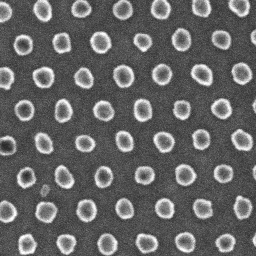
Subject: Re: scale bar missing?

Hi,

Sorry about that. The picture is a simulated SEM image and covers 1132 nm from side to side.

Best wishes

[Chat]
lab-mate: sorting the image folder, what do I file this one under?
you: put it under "a regular array of raised bodies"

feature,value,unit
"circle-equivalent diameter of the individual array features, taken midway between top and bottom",0.0821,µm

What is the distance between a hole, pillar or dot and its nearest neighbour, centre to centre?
168 nanometres